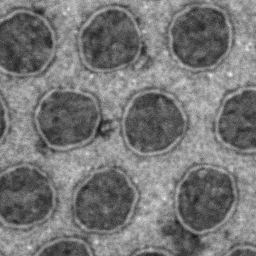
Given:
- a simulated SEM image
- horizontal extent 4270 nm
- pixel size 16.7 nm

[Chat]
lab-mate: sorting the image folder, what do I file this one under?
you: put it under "raised bodies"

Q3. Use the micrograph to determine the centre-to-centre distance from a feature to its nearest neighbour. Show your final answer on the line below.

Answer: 1500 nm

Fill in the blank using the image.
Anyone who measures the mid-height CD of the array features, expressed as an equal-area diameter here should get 1040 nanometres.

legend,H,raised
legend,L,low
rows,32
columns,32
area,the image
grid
LLLLLLLLLLLLLLLLLLLLLLLLLLLLLLLL
LLHHLLLLLLLLHHHHLLLLLLLHHHHHLLLL
HHHHHLLLLLLHHHHHHLLLLLHHHHHHLLLL
HHHHHHLLLLHHHHHHHLLLLHHHHHHHHLLL
HHHHHHHLLLHHHHHHHLLLLHHHHHHHHLLL
HHHHHHHLLLHHHHHHHLLLLHHHHHHHHLLL
HHHHHHHLLLHHHHHHHLLLLLHHHHHHLLLL
HHHHHHLLLLHHHHHHHLLLLLHHHHHHLLLL
HHHHHLLLLLLHHHHLLLLLLLLLHHLLLLLL
LLLLLLLLLLLLLLLLLLLLLLLLLLLLLLLL
LLLLLLLLLLLLLLLLLLLLLLLLLLLLLLLL
LLLLLLLHHHLLLLLLLLHHLLLLLLLLLLHH
LLLLLHHHHHHHLLLLLHHHHHLLLLLLHHHH
HLLLLHHHHHHHLLLLHHHHHHLLLLLLHHHH
HLLLLHHHHHHHLLLLHHHHHHHLLLLHHHHH
HLLLLHHHHHHHLLLHHHHHHHHLLLLHHHHH
HLLLLHHHHHHHLLLHHHHHHHHLLLLHHHHH
LLLLLLHHHHHLLLLLHHHHHHLLLLLLHHHH
LLLLLLLHLLLLLLLLLHHHHLLLLLLLLHHH
LLLLLLLLLLLLLLLLLLLLLLLLLLLLLLLL
LLLLLLLLLLLLLLLLLLLLLLLLLLLLLLLL
LHHHHLLLLLLLHHHLLLLLLLLLHHHHLLLL
HHHHHHLLLLLHHHHHLLLLLLLHHHHHHLLL
HHHHHHHLLLHHHHHHHLLLLLHHHHHHHLLL
HHHHHHHLLHHHHHHHHLLLLLHHHHHHHLLL
HHHHHHHLLHHHHHHHHLLLLLHHHHHHHLLL
HHHHHHLLLHHHHHHHLLLLLLHHHHHHHLLL
HHHHHLLLLLHHHHHHLLLLLLLHHHHHLLLL
LLLLLLLLLLLHHHHLLLLLLLLLHHHLLLLL
LLLLLLLLLLLLLLLLLLLLLLLLLLLLLLLL
LLLLLLHHHHHLLLLLLLLLLLLLLLLLLLLL
LLLLLHHHHHHLLLLLLHHHLLLLLLLLLHHH